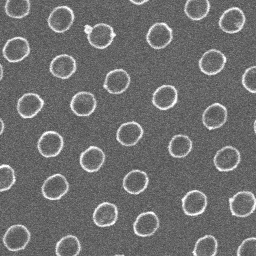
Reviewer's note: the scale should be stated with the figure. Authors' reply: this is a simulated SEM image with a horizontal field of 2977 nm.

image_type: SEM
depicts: a regular array of raised bodies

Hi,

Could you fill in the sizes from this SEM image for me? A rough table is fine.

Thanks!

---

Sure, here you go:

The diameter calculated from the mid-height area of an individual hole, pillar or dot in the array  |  285 nanometres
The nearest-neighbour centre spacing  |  0.516 micrometres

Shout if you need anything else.